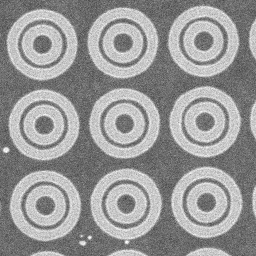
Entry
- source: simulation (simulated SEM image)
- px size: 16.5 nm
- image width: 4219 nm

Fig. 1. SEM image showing an array of small figures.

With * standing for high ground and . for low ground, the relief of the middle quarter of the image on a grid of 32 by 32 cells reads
.*******....******...********...
**********..........**********..
***********.......**************
********************************
********************************
********************************
**************...***************
***********........***********..
**********...........********...
.********..********...******...*
..******...**....***..******..**
...****...**......***..****...**
*..****..**...**...**..****..**.
*..****..**..****...*...***..**.
*...***..*...*****..*...***..*..
*...***..*...*****..*...***..**.
*..****..**..****...*..****..**.
*..****..**....*...**..****..***
...*****..**......**...*****..**
..******..****..****..******...*
..*******...******...*********..
.*********..........***********.
***********........*************
********************************
********************************
********************************
****************.***************
************.......************.
**********...........*********..
.********...*******...*******...
..******...***...***...*****...*
*..*****..**.......**..*****..**